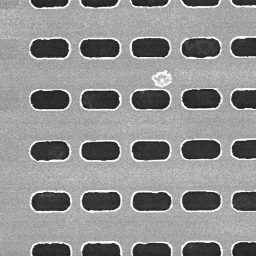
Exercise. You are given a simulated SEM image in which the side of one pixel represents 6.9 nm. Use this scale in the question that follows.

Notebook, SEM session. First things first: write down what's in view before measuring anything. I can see a regular array of holes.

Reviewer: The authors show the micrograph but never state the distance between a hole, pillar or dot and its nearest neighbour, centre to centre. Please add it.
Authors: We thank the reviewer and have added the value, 347 nm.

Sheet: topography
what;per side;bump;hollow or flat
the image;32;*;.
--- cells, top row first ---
****....**.....**....**....**...
********************************
********************************
********************************
********************************
****.....*.....*.....**.....*...
****.....*.....*.....**.....*...
********************************
********************************
********************************
********************************
****....***....**....**....**...
****.....*.....*.....**.....*...
****....***....**....**....***..
********************************
********************************
********************************
************************...***..
****.....*.....*.....**.....*...
****.....*.....**....**....**...
********************************
********************************
********************************
********************************
****.....*.....**....**....**...
****.....*.....*.....**.....*...
******************..************
********************************
********************************
********************************
*****...***....**....**....***..
****.....*.....*......*.....*...